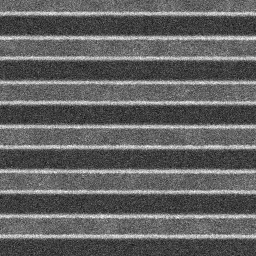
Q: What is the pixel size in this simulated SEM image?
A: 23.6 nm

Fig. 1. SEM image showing parallel lines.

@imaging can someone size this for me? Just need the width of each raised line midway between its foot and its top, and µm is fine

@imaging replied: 0.509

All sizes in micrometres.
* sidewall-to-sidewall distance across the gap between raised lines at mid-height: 0.533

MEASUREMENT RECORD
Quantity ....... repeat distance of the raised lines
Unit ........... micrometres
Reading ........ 1.05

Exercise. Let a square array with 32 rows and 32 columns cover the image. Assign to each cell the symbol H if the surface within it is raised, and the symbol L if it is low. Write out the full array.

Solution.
HHHHHHHHHHHHHHHHHHHHHHHHHHHHHHHH
HHHHHHHHHHHHHHHHHHHHHHHHHHHHHHHH
LLLLLLLLLLLLLLLLLLLLLLLLLLLLLLLL
LLLLLLLLLLLLLLLLLLLLLLLLLLLLLLLL
LLLLLLLLLLLLLLLLLLLLLLLLLLLLLLLL
HHHHHHHHHHHHHHHHHHHHHHHHHHHHHHHH
HHHHHHHHHHHHHHHHHHHHHHHHHHHHHHHH
LLLLLLLLLLLLLLLLLLLLLLLLLLLLLLLL
LLLLLLLLLLLLLLLLLLLLLLLLLLLLLLLL
LLLLLLLLLLLLLLLLLLLLLLLLLLLLLLLL
HHHHHHHHHHHHHHHHHHHHHHHHHHHHHHHH
HHHHHHHHHHHHHHHHHHHHHHHHHHHHHHHH
HHHHHHHHHHHHHHHHHHHHHHHHHHHHHHHH
LLLLLLLLLLLLLLLLLLLLLLLLLLLLLLLL
LLLLLLLLLLLLLLLLLLLLLLLLLLLLLLLL
LLLLLLLLLLLLLLLLLLLLLLLLLLLLLLLL
HHHHHHHHHHHHHHHHHHHHHHHHHHHHHHHH
HHHHHHHHHHHHHHHHHHHHHHHHHHHHHHHH
LLLLLLLLLLLLLLLLLLLLLLLLLLLLLLLL
LLLLLLLLLLLLLLLLLLLLLLLLLLLLLLLL
LLLLLLLLLLLLLLLLLLLLLLLLLLLLLLLL
HHHHHHHHHHHHHHHHHHHHHHHHHHHHHHHH
HHHHHHHHHHHHHHHHHHHHHHHHHHHHHHHH
HHHHHHHHHHHHHHHHHHHHHHHHHHHHHHHH
LLLLLLLLLLLLLLLLLLLLLLLLLLLLLLLL
LLLLLLLLLLLLLLLLLLLLLLLLLLLLLLLL
LLLLLLLLLLLLLLLLLLLLLLLLLLLLLLLL
HHHHHHHHHHHHHHHHHHHHHHHHHHHHHHHH
HHHHHHHHHHHHHHHHHHHHHHHHHHHHHHHH
HHHHHHHHHHHHHHHHHHHHHHHHHHHHHHHH
LLLLLLLLLLLLLLLLLLLLLLLLLLLLLLLL
LLLLLLLLLLLLLLLLLLLLLLLLLLLLLLLL